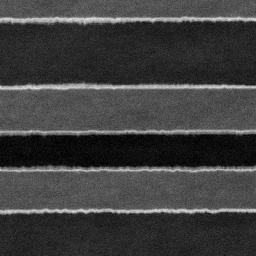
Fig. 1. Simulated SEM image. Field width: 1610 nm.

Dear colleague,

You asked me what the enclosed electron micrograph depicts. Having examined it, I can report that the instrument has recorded lines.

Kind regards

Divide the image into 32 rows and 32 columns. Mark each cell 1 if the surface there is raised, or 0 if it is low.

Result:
11111111111111111111111111111111
11111111111111111111111111111111
00000000000000000000000000000000
00000000000000000000000000000000
00000000000000000000000000000000
00000000000000000000000000000000
00000000000000000000000000000000
00000000000000000000000000000000
00000000000000000000000000000000
00000000000000000000000000000000
00000000000000000000000000000000
11111111111111111111111111111111
11111111111111111111111111111111
11111111111111111111111111111111
11111111111111111111111111111111
11111111111111111111111111111111
00110100010000000000000000000000
00000000000000000000000000000000
00000000000000000000000000000000
00000000000000000000000000000000
00000000000000000000000000000000
11111111111111111111111111111111
11111111111111111111111111111111
11111111111111111111111111111111
11111111111111111111111111111111
11111111111111111111111111111111
00000000000000000000000000000000
00000000000000000000000000000000
00000000000000000000000000000000
00000000000000000000000000000000
00000000000000000000000000000000
00000000000000000000000000000000